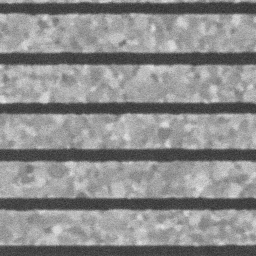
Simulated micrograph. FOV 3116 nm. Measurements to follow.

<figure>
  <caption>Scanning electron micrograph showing lines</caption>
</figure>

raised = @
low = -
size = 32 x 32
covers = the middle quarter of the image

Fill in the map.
@@@@@@@@@@@@@@@@@@@@@@@-@@@@@@@@
@@@@@@@@@@@@@@@@@@@@@@@@@@@@@@@@
@@@@@@@@@@@@@@@@@@@@@@@@@@@@@@@@
@@@@@@@@@@@@@@@@@@@@@@@@@@@@@@@@
@@@@@@@@@@@@@@@@@@@@@@@@@@@@@@@@
@@@@@@@@@@@@@@@@@@@@@@@@@@@@@@@@
@@@@@@@@@@@@@@@@@@@@@@@@@@@@@@@@
@@@@@@@@@@@@@@@@@@@@@@@@@@@@@@@@
@@@@@@@@@@@@@@@@@@@@@@@@@@@@@@@@
@-@-@@--------------------------
--------------------------------
--------------------------------
----------------@---------------
@@@@@@@@@@@@@@@@@@@@@@@@@@@@@@@@
@@@@@@@@@@@@@@@@@@@@@@@@@@@@@@@@
@@@@@@@@@@@@@@@@@@@@@@@@@@@@@@@@
@@@@@@@@@@@@@@@@@@@@@@@@@@@@@@@@
@@@@@@@@@@@@@@@@@@@@@@@@@@@@@@@@
@@@@@@@@@@@@@@@@@@@@@@@@@@@@@@@@
@@@@@@@@@@@@@@@@@@@@@@@@@@@@@@@@
@@@@@@@@@@@@@@@@@@@@@@@@@@@@@@@@
--------------------------------
--------------------------------
--------------------------------
-@@@@@@---@@@@@@@@@@@@@----@@@@@
@@@@@@@@@@@@@@@@@@@@@@@@@@@@@@@@
@@@@@@@@@@@@@@@@@@@@@@@@@@@@@@@@
@@@@@@@@@@@@@@@@@@@@@@@@@@@@@@@@
@@@@@@@@@@@@@@@@@@@@@@@@@@@@@@@@
@@@@@@@@@@@@@@@@@@@@@@@@@@@@@@@@
@@@@@@@@@@@@@@@@@@@@@@@@@@@@@@@@
@@@@@@@@@@@@@@@@@@@@@@@@@@@@@@@@